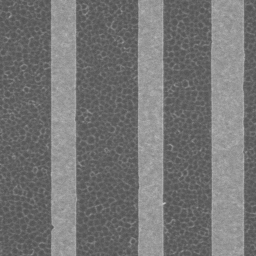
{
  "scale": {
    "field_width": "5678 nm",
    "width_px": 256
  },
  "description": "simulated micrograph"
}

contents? one or a few lines or trenches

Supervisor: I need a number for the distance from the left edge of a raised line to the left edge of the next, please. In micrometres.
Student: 1.82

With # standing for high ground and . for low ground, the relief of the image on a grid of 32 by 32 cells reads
......###........###......####..
......###........###.......###..
......###........###.......###..
......###........###.......###..
......###........###.......###..
......###........###.......###..
......###........###......#####.
......###........###......#####.
......###........###......####..
......###........###......####..
......###........###......####..
......###........###.......###..
......###........###.......###..
......###........###.......###..
......###........###.......###..
......###........###.......###..
......###........###.......###..
......###........###.......###..
......###........###.......###..
......###........###......####..
......###........###.......###..
......###........###.......###..
......###........###.......###..
......###........###.......###..
......####.......###.......###..
......####.......###.......###..
......###........###.......###..
......###........###.......###..
.......##........###.......###..
......###........###.......###..
.......##........###.......###..
.......##........###.......###..